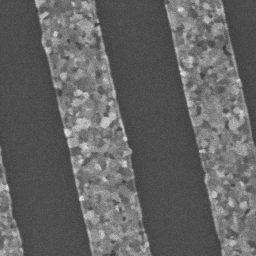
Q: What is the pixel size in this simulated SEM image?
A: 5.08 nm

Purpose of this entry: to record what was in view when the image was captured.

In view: one or a few lines or trenches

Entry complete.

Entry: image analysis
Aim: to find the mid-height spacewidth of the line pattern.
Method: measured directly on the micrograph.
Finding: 0.354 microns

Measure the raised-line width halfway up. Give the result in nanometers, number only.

284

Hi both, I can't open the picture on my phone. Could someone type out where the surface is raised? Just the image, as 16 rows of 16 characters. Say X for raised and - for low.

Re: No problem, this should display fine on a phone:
--XXXX----XXXX--
---XXX-----XXX--
---XXX-----XXX--
---XXXX----XXXX-
---XXXX----XXXX-
---XXXX-----XXX-
----XXX-----XXX-
----XXXX----XXXX
----XXXX----XXXX
----XXXX----XXXX
-----XXX-----XXX
-----XXX-----XXX
X----XXXX----XXX
X----XXXX----XXX
X-----XXX-----XX
X-----XXX-----XX